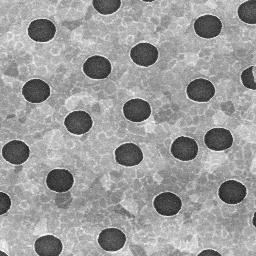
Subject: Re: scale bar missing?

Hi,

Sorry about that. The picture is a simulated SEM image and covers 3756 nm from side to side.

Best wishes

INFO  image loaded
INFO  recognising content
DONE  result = a regular array of holes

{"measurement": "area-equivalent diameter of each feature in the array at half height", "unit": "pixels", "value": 26.6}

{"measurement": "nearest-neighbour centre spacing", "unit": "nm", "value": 769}